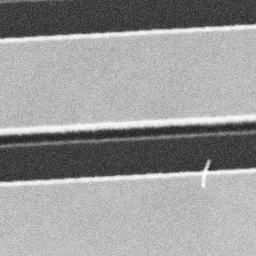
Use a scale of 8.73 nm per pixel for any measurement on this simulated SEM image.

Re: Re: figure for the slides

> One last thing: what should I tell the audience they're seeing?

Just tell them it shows lines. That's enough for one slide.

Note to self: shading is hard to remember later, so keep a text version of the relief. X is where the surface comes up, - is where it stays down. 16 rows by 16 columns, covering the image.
----------------
----------------
XXXXXXXXXXXXXXXX
XXXXXXXXXXXXXXXX
XXXXXXXXXXXXXXXX
XXXXXXXXXXXXXXXX
XXXXXXXXXXXXXXXX
XXXXXXXXXXXXXXX-
----------------
----------------
----------------
XXXXXXXXXXXXXXXX
XXXXXXXXXXXXXXXX
XXXXXXXXXXXXXXXX
XXXXXXXXXXXXXXXX
XXXXXXXXXXXXXXXX